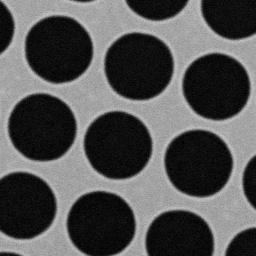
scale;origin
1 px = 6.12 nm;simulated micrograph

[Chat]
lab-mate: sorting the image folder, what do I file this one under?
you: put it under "holes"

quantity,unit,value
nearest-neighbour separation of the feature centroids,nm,482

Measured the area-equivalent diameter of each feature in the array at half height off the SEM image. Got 421 nm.